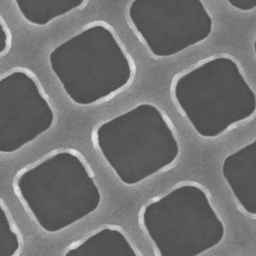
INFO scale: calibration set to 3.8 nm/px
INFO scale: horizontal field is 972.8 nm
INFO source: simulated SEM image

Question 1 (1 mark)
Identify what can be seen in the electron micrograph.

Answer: holes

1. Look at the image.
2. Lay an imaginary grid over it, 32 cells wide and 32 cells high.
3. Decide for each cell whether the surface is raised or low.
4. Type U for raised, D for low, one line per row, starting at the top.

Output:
UUDDDDDDDDUUUUUUUDDDDDDDDUUUUDDD
UUUDDDDDUUUUUUUUDDDDDDDDDDUUUUUU
UUUUDDUUUUUUUUUUDDDDDDDDDDUUUUUU
UUUUUUUUUUUDDUUUUDDDDDDDDDUUUUUU
DUUUUUUUUUDDDDUUUUDDDDDDDDUUUUUU
DUUUUUUUDDDDDDDUUUDDDDDDUUUUUUUU
UUUUUUUDDDDDDDDUUUUDDDUUUUUUUUUU
UUUUUUDDDDDDDDDDUUUUUUUUUUUDDUUU
UUUUUUUDDDDDDDDDUUUUUUUUUDDDDDUU
UDDUUUUDDDDDDDDDUUUUUUUDDDDDDDUU
DDDDUUUUDDDDDDDDUUUUUUDDDDDDDDDU
DDDDDUUUDDDDDDUUUUUUUUDDDDDDDDDD
DDDDDDUUUDDDUUUUUUUUUUDDDDDDDDDD
DDDDDDUUUUUUUUUUUDDUUUUDDDDDDDDD
DDDDDDDUUUUUUUUDDDDDUUUDDDDDDDDU
DDDDDDUUUUUUUDDDDDDDDUUUDDDDDUUU
DDDDDUUUUUUUDDDDDDDDDUUUUDDDUUUU
DDDDUUUUUUUUDDDDDDDDDDUUUUUUUUUU
DDUUUUUUUUUUUDDDDDDDDDUUUUUUUUDD
UUUUUUUDDUUUUDDDDDDDDDUUUUUUUDDD
UUUUUDDDDDUUUUDDDDDDDUUUUUUUDDDD
UUUDDDDDDDDUUUUDDDDDUUUUUUUUDDDD
UUDDDDDDDDDDUUUDDDUUUUUUUUUUDDDD
UUDDDDDDDDDDUUUUUUUUUUDDDUUUUDDD
UUUDDDDDDDDDUUUUUUUUUDDDDDUUUDDD
UUUDDDDDDDDDUUUUUUUDDDDDDDUUUUDD
UUUUDDDDDDDUUUUUUUDDDDDDDDDUUUUD
DUUUUDDDDDUUUUUUUUDDDDDDDDDUUUUU
DUUUUDDDUUUUUUUUUUDDDDDDDDDDUUUU
DDUUUUUUUUUUDDDUUUUDDDDDDDDDUUUU
DDUUUUUUUUDDDDDDUUUDDDDDDDDUUUUU
DDUUUUUUUDDDDDDDDUUUDDDDDUUUUUUU